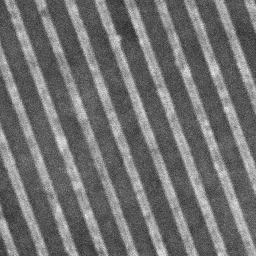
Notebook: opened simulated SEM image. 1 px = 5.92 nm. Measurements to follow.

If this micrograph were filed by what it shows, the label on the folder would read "parallel lines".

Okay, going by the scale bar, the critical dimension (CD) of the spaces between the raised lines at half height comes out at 124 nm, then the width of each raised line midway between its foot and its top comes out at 39.6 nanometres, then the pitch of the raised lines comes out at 28.1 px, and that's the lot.